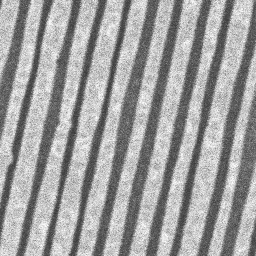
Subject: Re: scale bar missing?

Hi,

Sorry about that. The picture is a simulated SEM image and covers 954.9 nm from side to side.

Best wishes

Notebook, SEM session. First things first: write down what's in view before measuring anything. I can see parallel lines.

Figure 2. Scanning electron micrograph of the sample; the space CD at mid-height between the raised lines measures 0.0351 micrometres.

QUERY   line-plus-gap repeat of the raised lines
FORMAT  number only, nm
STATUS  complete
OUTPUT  94.2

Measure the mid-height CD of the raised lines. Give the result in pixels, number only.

15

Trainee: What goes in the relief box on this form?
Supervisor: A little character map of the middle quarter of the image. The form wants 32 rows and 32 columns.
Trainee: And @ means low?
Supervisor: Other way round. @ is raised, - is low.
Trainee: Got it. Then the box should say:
-@@@@--@@@@@-@@@@---@@@@---@@@@-
-@@@@--@@@@--@@@@---@@@@--@@@@--
-@@@--@@@@@--@@@----@@@---@@@@--
-@@@--@@@@@--@@@----@@@---@@@@--
@@@@--@@@@@-@@@@---@@@@---@@@@--
@@@@-@@@@@@-@@@@---@@@@--@@@@@--
@@@@-@@@@@--@@@----@@@@--@@@@---
@@@--@@@@@--@@@----@@@---@@@@---
@@@--@@@@@--@@@----@@@---@@@@---
@@@--@@@@@-@@@@----@@@---@@@@---
@@@--@@@@@-@@@----@@@@--@@@@@--@
@@--@@@@@--@@@----@@@---@@@@---@
@@--@@@@@--@@@----@@@---@@@@---@
@@--@@@@@--@@@----@@@---@@@@---@
@@--@@@@@--@@@----@@@---@@@----@
@@--@@@@--@@@-----@@@---@@@---@@
@--@@@@@--@@@----@@@---@@@@---@@
@--@@@@---@@@----@@@---@@@@---@@
@--@@@@---@@@----@@@---@@@@---@@
@--@@@@--@@@@---@@@@---@@@@---@@
---@@@@--@@@@---@@@----@@@@--@@@
--@@@@@--@@@@---@@@---@@@@---@@@
--@@@@---@@@@---@@@---@@@@---@@@
--@@@@---@@@----@@@---@@@@--@@@@
--@@@@--@@@@---@@@----@@@@--@@@-
-@@@@@--@@@@---@@@---@@@@---@@@-
-@@@@---@@@@---@@@---@@@@---@@@-
-@@@@---@@@---@@@@---@@@@--@@@@-
-@@@@--@@@@---@@@----@@@@--@@@@-
-@@@@--@@@@---@@@---@@@@@--@@@--
@@@@@--@@@@---@@@---@@@@---@@@--
@@@@---@@@@---@@@---@@@@--@@@@--